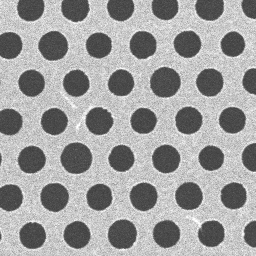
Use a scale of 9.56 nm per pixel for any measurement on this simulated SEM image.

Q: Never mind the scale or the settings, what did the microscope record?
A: a regular array of holes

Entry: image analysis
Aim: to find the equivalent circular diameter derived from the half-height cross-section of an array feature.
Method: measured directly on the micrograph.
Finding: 263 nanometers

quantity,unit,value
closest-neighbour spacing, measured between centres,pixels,43.6